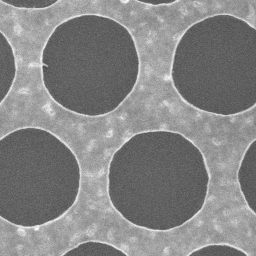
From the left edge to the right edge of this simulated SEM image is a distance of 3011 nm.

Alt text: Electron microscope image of holes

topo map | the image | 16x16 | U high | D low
UUUUUUUUUUUUUUUU
UUUUDDDUUUUUDDDU
UUUDDDDDUUUDDDDD
DUUDDDDDDUUDDDDD
DUUDDDDDDUUDDDDD
DUUDDDDDUUUDDDDD
UUUUDDDUUUUUDDDD
UUUUUUUUUUUUUUUU
DDDUUUUUDDDUUUUU
DDDDUUUDDDDDUUUD
DDDDDUUDDDDDDUUD
DDDDDUUDDDDDDUUD
DDDDDUUDDDDDDUUD
DDDDUUUUDDDDUUUU
UUUUUUUUUUUUUUUU
UUUUUDDUUUUUUDDU